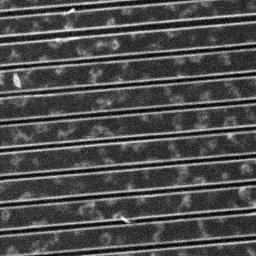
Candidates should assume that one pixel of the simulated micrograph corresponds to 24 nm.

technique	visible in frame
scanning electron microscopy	parallel lines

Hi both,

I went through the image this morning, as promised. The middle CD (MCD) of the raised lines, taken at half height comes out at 0.518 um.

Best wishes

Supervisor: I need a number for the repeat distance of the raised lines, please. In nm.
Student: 656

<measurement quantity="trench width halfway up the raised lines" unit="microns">0.144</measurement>